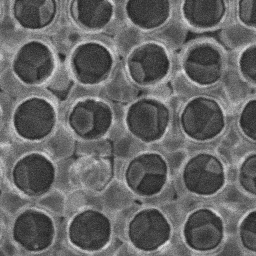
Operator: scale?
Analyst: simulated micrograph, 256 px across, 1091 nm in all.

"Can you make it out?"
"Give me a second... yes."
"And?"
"a regular array of holes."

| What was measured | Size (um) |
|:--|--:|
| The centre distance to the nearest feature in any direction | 0.229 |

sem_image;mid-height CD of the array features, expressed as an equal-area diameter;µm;0.17